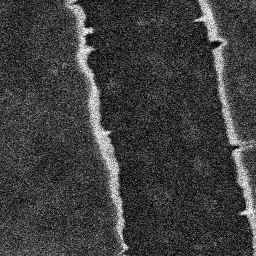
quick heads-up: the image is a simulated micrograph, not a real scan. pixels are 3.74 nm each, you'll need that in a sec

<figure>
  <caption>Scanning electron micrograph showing one or a few lines or trenches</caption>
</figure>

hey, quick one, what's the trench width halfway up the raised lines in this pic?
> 0.471 microns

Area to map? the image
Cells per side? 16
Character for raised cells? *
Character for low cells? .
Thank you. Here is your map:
*****........***
*****........***
*****........***
*****.........**
******........**
******........**
******........**
******........**
******........**
*******........*
*******........*
*******........*
*******........*
********........
********........
********........